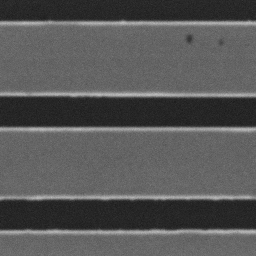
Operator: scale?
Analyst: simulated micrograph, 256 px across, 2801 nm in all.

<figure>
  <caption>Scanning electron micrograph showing lines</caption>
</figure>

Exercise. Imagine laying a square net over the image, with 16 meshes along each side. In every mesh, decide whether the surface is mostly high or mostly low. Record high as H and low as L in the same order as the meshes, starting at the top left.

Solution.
LLLLLLLLLLLLLLLL
HHHHHHHHHHHHHHHH
HHHHHHHHHHHHHHHH
HHHHHHHHHHHHHHHH
HHHHHHHHHHHHHHHH
HHHHHHHHHHHHHHHH
LLLLLLLLLLLLLLLL
LLLLLLLLLLLLLLLL
HHHHHHHHHHHHHHHH
HHHHHHHHHHHHHHHH
HHHHHHHHHHHHHHHH
HHHHHHHHHHHHHHHH
LLLLLLLLLLLLLLLL
LLLLLLLLLLLLLLLL
HHHHHHHHHHHHHHHH
HHHHHHHHHHHHHHHH